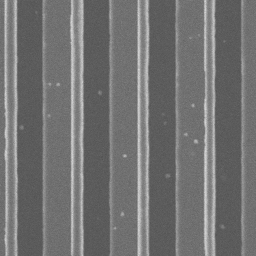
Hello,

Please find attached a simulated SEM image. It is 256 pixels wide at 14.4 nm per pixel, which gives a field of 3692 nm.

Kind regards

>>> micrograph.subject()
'lines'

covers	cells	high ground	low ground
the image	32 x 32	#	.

##...#####....####....#####...##
##...#####....####....#####...##
##...#####....####....#####...##
##...#####....#####...#####...##
##...#####....#####...#####...##
##...#####....#####...#####...##
##...#####....#####...#####...##
##...#####....#####...#####...##
##...#####....####....#####...##
##...#####....####....#####...##
##...#####....####....#####...##
##....####....####....#####...##
##....####....#####...#####...##
##...#####....####....#####...##
##...#####....####....#####...##
##....####....####....#####...##
##....####....####....#####...##
##...#####....####....#####...##
##....####....#####...#####...##
##....####....#####...#####...##
##....####....#####...#####...##
##....####....####....#####...##
##...#####....####....#####...##
##....####....####....#####...##
##...#####....#####...#####...##
##...#####....#####...#####...##
##...#####....####....#####...##
##....####....####....#####...##
##....####....#####...#####...##
##....####....####....#####...##
##....####....####....#####...##
##...#####....#####...#####...##